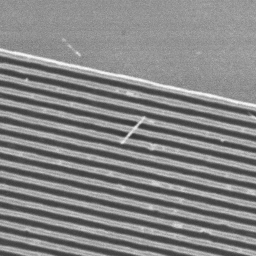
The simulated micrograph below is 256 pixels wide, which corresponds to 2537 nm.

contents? parallel lines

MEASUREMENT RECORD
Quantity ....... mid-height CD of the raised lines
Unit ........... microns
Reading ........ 0.0532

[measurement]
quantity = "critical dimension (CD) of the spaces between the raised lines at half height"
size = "0.0617 um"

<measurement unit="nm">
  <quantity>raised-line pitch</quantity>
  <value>118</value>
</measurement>